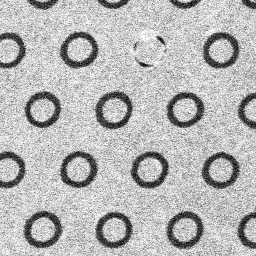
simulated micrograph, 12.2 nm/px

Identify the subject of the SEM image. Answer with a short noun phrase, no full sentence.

a regular array of ring-shaped grooves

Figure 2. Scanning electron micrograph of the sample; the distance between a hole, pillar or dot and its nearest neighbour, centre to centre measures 0.838 µm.